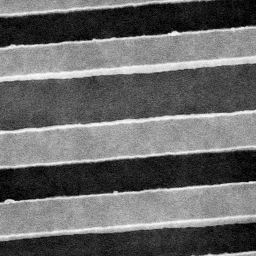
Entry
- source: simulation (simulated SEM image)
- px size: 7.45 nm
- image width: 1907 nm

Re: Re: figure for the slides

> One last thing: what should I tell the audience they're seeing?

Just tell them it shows lines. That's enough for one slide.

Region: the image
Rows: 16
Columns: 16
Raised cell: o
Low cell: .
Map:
oooooo..........
................
......oooooooooo
oooooooooooooooo
oooooo..........
................
................
.........ooooooo
oooooooooooooooo
oooooooooooo....
................
..............oo
..oooooooooooooo
oooooooooooooooo
ooooo...........
................